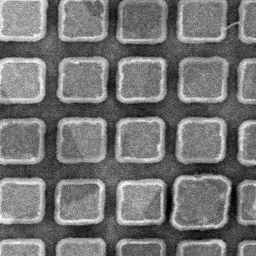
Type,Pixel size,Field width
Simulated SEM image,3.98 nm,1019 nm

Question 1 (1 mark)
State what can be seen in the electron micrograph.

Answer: a regular array of raised bodies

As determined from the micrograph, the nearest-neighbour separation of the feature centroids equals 0.237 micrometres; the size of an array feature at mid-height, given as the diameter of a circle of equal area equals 0.193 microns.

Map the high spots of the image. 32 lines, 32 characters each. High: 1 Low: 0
11111000111110011111100111110011
11111000111110011111101111110011
11111000111110011111101111110011
11111000111110011111101111110011
11111000111110011111001111110011
00000000000000000000000000000000
00000000000000000000000000000000
00001000111110001111000111110000
11111000111110011111000111110011
11111000111110011111000111110011
11111000111110011111000111110011
11111000111110011111001111110011
11111000111110011110000100100011
00000000000000000000000000000000
00000000000000000000000000000000
11111000111110011111000111110001
11111000111110011111001111110011
11111001111110011111001111110011
11111001111110011111001111110011
11111001111110011111001111110011
00000000000000000000000000000000
00000000000000000000000000000000
00001000000000000000001111110000
11111001111110011111001111111011
11111001111110011111001111111011
11111001111110011111001111111011
11111001111110011111001111110011
11111001111100011111001111110011
00000000000000000000000111000000
00000000000000000000000000000000
11111000111110011111000111110011
11111001111110011111001111110011